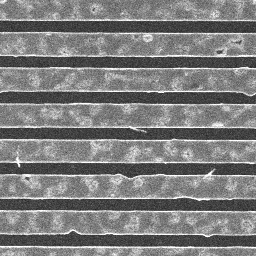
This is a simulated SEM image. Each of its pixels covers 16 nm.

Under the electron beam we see parallel lines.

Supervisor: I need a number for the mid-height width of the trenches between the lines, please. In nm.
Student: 192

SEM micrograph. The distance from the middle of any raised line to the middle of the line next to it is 35.5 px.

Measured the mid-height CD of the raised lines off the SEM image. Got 0.383 µm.